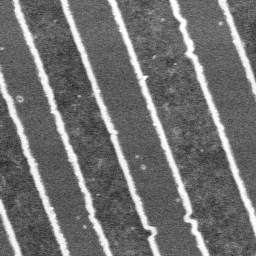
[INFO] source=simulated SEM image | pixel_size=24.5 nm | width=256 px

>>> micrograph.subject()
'one or a few lines or trenches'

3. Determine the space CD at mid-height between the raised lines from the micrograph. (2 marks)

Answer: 1140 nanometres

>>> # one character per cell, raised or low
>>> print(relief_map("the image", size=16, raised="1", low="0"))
1000111000011100
1000111100011100
1100011100001110
1100011100001110
1110001110001111
1110001110000111
0110001110000111
0111000111000011
0111000111000011
0011000111000011
0011100011100001
0011100011100001
0001100001110001
0001110001110000
1000110001110000
1000111000111000